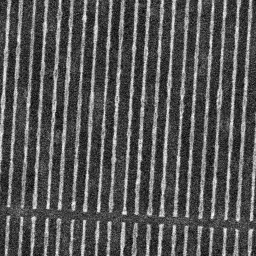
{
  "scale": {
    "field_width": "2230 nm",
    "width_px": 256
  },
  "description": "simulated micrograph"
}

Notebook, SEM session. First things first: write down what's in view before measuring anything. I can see parallel lines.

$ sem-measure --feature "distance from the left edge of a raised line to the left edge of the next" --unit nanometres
111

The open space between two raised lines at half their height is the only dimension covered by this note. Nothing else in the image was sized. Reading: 92.3 nm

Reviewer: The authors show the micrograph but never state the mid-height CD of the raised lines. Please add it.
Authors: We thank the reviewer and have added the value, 0.0228 um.